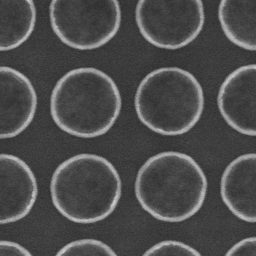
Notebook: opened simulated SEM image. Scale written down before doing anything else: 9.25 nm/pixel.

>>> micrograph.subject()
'raised bodies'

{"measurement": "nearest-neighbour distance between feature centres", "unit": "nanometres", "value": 781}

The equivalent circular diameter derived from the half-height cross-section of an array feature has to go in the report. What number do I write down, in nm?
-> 606